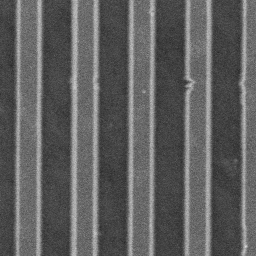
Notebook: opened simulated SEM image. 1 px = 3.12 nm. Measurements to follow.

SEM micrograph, parallel lines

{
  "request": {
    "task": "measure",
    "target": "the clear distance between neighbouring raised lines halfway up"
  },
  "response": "110 nm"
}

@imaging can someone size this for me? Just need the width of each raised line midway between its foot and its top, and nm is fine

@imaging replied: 68.6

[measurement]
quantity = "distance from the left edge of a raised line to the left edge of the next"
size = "0.176 micrometres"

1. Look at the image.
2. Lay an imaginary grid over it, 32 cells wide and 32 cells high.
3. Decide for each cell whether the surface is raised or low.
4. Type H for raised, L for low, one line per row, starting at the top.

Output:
LLHHHLLLLHHHLLLLHHHLLLLLHHLLLLLH
LLHHHLLLLHHHLLLLHHHLLLLLHHLLLLLH
LLHHHLLLLHHHLLLLHHHLLLLLHHLLLLLH
LLHHHLLLLHHHLLLLHHHLLLLLHHLLLLLH
LLHHHLLLLHHHLLLLHHHLLLLLHHLLLLLH
LLHHHLLLLHHHLLLLHHHLLLLHHHLLLLLH
LLHHHLLLLHHHLLLLHHHLLLLHHHLLLLLH
LLHHHLLLLHHHLLLLHHHLLLLHHHLLLLLH
LLHHHLLLLHHHLLLLHHHLLLLHHHLLLLLH
LLHHHLLLLHHHLLLLHHHLLLLHHHLLLLHH
LLHHHLLLLHHHLLLLHHHLLLLLHHLLLLHH
LLHHHLLLLHHHLLLLHHHLLLLLHHLLLLHH
LLHHHLLLLHHHLLLLHHHLLLLHHHLLLLHH
LLHHHLLLLHHHLLLLHHHLLLLHHHLLLLHH
LLHHHLLLLHHHLLLLHHHLLLLHHHLLLLHH
LLHHHLLLLHHHLLLLHHHLLLLHHHLLLLHH
LLHHHLLLLHHHLLLLHHHLLLLHHHLLLLHH
LLHHHLLLLHHHLLLLHHHLLLLHHHLLLLHH
LLHHHLLLLHHHLLLLHHHLLLLHHHLLLLHH
LLHHHLLLLHHHLLLLHHHLLLLHHHLLLLHH
LLHHHLLLLHHHLLLLHHHLLLLHHHLLLLHH
LLHHHLLLLHHHLLLLHHHLLLLHHHLLLLHH
LLHHHLLLLHHHLLLLHHHLLLLHHHLLLLHH
LLHHHLLLLHHHLLLLHHHLLLLHHHLLLLHH
LLHHHLLLLHHHLLLLHHHLLLLHHHLLLLHH
LLHHHLLLLHHHLLLLHHHLLLLHHHLLLLHH
LLHHHLLLLHHHLLLLHHHLLLLHHHLLLLHH
LLHHHLLLLHHHLLLLHHHLLLLHHHLLLLHH
LLHHHLLLLHHHLLLLHHHLLLLHHHLLLLHH
LLHHHLLLLHHHLLLLHHHLLLLHHHLLLLLH
LLHHHLLLLHHHLLLLHHHLLLLHHHLLLLLH
LLHHHLLLLHHHLLLLHHHLLLLHHHLLLLHH